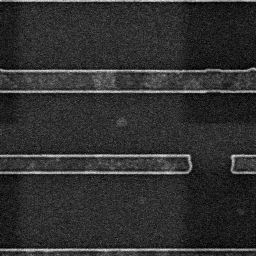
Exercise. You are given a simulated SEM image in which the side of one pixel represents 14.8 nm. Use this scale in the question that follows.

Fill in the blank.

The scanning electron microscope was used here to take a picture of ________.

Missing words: one or a few lines or trenches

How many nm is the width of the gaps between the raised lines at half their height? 1030